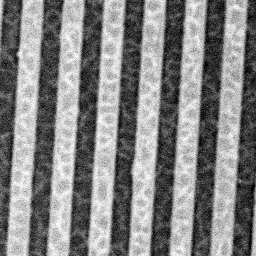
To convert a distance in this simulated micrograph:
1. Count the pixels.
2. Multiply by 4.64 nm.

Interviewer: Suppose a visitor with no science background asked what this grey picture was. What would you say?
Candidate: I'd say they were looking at parallel lines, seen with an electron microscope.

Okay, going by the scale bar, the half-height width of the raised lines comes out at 89.7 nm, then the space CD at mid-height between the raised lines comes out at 98.4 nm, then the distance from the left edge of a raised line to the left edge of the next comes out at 189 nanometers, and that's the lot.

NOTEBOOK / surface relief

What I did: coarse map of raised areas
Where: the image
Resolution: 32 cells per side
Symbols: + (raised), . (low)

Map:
...++...++...+++..+++..+++..+++.
...++...++...++...+++..+++..+++.
...++...++...++...+++..+++..+++.
...++...++...++...++...+++..+++.
...++...++...++...++...+++..+++.
...++...++...++...++...++...+++.
..+++...++...++...++...++...++..
..+++...++...++...++...++...++..
..+++..+++...++...++...++...++..
..+++..+++...++...++...++...++..
..+++..+++..+++..+++...++...++..
..+++..+++..+++...++...++...++..
..+++..+++..+++..+++...++...++..
..++...+++..+++..+++..+++...++..
..++...+++..+++..+++..+++..+++..
..++...++...+++..+++..+++..+++..
..++...++...++...+++..+++..+++..
..++...++...++...+++..+++..+++..
..++...++...++...+++..+++..+++..
..++...++...++...++...+++..+++..
..++...++...++...++...++...+++..
..++...++...++...++...++...+++..
.+++...++...++...++...++...++...
.+++...++...++...++...++...++...
.+++...++...++...++...++...++...
.+++..+++...++...++...++...++...
.+++..+++..+++...++...++...++...
.+++..+++..+++...++...++...++...
.+++..+++..+++..+++...++...++...
.++...+++..+++..+++..+++...++...
.++...++...+++..+++..+++..+++...
.++...+++..+++..+++..+++..+++..+